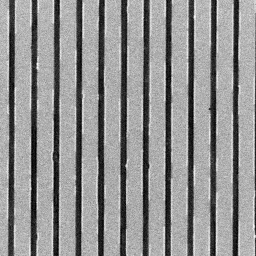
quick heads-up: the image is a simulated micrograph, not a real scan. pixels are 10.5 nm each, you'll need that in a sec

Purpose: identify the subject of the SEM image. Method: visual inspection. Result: parallel lines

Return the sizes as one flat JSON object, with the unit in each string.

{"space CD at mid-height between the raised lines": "65.8 nanometres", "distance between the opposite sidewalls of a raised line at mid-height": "171 nm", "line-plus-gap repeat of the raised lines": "22.4 px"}